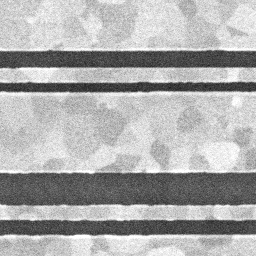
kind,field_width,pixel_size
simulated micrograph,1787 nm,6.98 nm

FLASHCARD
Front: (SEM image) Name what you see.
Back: lines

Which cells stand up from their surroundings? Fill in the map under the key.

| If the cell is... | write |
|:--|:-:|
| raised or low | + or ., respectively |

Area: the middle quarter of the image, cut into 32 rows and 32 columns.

................................
++++++++++++++++++++++++++++++++
++++++++++++++++++++++++++++++++
++++++++++++++++++++++++++++++++
+++++++++++++++++++..++++++++++.
................................
................................
++++++++++++++++++++++++++++++++
++++++++++++++++++++++++++++++++
++++++++++++++++++++++++++++++++
++++++++++++++++++++++++++++++++
++++++++++++++++++++++++++++++++
++++++++++++++++++++++++++++++++
++++++++++++++++++++++++++++++++
++++++++++++++++++++++++++++++++
++++++++++++++++++++++++++++++++
++++++++++++++++++++++++++++++++
++++++++++++++++++++++++++++++++
++++++++++++++++++++++++++++++++
++++++++++++++++++++++++++++++++
++++++++++++++++++++++++++++++++
++++++++++++++++++++++++++++++++
++++++++++++++++++++++++++++++++
++++++++++++++++++++++++++++++++
++++++++++++++++++++++++++++++++
++++++++++++++++++++++++++++++++
++++++++++++++++++++++++++++++++
................................
................................
................................
................................
................................